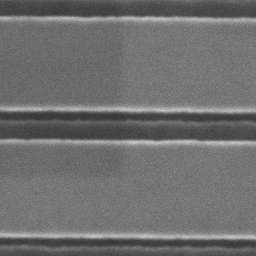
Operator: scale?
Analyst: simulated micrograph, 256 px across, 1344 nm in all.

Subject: lines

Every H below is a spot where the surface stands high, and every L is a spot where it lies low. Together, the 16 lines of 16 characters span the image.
LLLLLLLLLLLLLLLL
HHHHHHHHHHHHHHHH
HHHHHHHHHHHHHHHH
HHHHHHHHHHHHHHHH
HHHHHHHHHHHHHHHH
HHHHHHHHHHHHHHHH
HHHHHHHHHHHHHHHH
LLLLLLLLLLLLLLLL
LLLLLLLLLLLLLLLL
HHHHHHHHHHHHHHHH
HHHHHHHHHHHHHHHH
HHHHHHHHHHHHHHHH
HHHHHHHHHHHHHHHH
HHHHHHHHHHHHHHHH
HHHHHHHHHHHHHHHH
LLLLLLLLLLLLLLLL